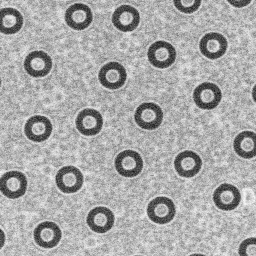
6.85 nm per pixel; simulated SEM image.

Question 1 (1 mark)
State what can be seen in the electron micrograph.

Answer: a regular array of ring-shaped grooves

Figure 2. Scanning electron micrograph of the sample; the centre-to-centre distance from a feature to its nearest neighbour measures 351 nanometers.